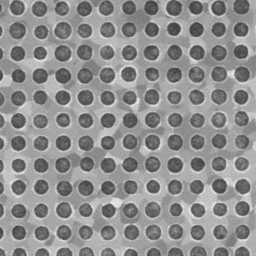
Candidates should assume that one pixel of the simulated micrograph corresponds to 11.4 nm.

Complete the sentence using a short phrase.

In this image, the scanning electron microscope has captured a regular array of holes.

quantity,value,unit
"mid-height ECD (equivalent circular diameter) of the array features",179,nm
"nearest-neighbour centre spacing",0.25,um